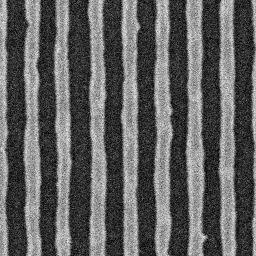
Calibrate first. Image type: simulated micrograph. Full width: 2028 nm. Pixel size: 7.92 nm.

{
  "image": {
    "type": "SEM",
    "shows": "parallel lines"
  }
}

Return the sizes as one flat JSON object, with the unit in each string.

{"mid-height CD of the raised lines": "93 nanometers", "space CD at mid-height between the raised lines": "164 nanometers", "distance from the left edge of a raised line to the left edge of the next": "257 nm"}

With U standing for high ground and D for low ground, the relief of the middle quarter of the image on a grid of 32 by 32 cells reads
UDDDDDDUUUDDDDDUUUDDDDDUUUDDDDDU
UDDDDDDUUUDDDDDUUUDDDDDUUUDDDDDU
UDDDDDDUUUDDDDDUUUDDDDDUUUDDDDDU
UDDDDDDUUUDDDDDUUUDDDDDUUUDDDDDU
UDDDDDDUUUDDDDDUUUDDDDDUUUDDDDDU
UDDDDDDUUUDDDDDUUUDDDDDUUUDDDDDU
UDDDDDDUUUDDDDDUUUDDDDDUUUDDDDDU
UDDDDDDUUUDDDDDUUUDDDDDUUUDDDDDU
UDDDDDDUUUDDDDDUUUDDDDDUUUDDDDDU
UDDDDDDUUUDDDDDUUUDDDDDUUUDDDDDD
UDDDDDDUUUDDDDDUUUDDDDDUUUDDDDDD
UDDDDDDUUUDDDDDUUUDDDDDUUUUDDDDU
UDDDDDDUUUDDDDDUUUDDDDDUUUUDDDDU
UDDDDDDUUUDDDDDUUUDDDDDUUUDDDDDU
UDDDDDDUUUDDDDDUUUDDDDDUUUDDDDDU
UDDDDDDUUUDDDDDUUUDDDDDUUUUDDDDD
UDDDDDDUUUDDDDDUUUDDDDDDUUUDDDDU
UDDDDDDUUUDDDDDUUUDDDDDDUUUDDDDU
UDDDDDDUUUDDDDDUUUDDDDDDUUUDDDDU
UDDDDDDUUUDDDDDUUUDDDDDUUUDDDDDU
UDDDDDDUUUDDDDDUUUDDDDDUUUDDDDDU
UDDDDDDUUUDDDDDUUUDDDDDUUUDDDDDU
UDDDDDDUUUDDDDDUUUDDDDDUUUDDDDDU
UDDDDDDUUUDDDDDUUUDDDDDUUUDDDDDU
UUDDDDDUUUDDDDDUUUDDDDDUUUDDDDDU
UUDDDDDUUUDDDDDUUUDDDDDUUUDDDDDU
UDDDDDDUUUDDDDDUUUDDDDDUUUDDDDDU
UDDDDDDUUUDDDDDUUUDDDDDUUUDDDDDU
UDDDDDDUUUDDDDDUUUDDDDDUUUDDDDDU
UDDDDDDUUUDDDDDUUUDDDDDUUUDDDDDU
UDDDDDDUUUDDDDDUUUDDDDDUUUDDDDDU
UDDDDDDUUUDDDDDUUUDDDDDUUUDDDDDU